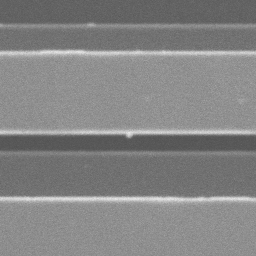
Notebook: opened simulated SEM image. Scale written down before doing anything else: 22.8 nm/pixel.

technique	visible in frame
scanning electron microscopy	lines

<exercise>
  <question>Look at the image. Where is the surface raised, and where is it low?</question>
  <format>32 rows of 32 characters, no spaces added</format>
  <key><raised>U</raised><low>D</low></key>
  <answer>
DDDDDDDDDDDDDDDDDDDDDDDDDDDDDDDD
DDDDDDDDDDDDDDDDDDDDDDDDDDDDDDDD
DDDDDDDDDDDDDDDDDDDDDDDDDDDDDDDD
UUUUUUUUUUUUUUUUUUUUUUUUUUUUUUUU
UUUUUUUUUUUUUUUUUUUUUUUUUUUUUUUU
UUUUUUUUUUUUUUUUUUUUUUUUUUUUUUUU
UUUUUUUUUUUUUUUUUUUUUUUUUUUUUUUU
UUUUUUUUUUUUUUUUUUUUUUUUUUUUUUUU
UUUUUUUUUUUUUUUUUUUUUUUUUUUUUUUU
UUUUUUUUUUUUUUUUUUUUUUUUUUUUUUUU
UUUUUUUUUUUUUUUUUUUUUUUUUUUUUUUU
UUUUUUUUUUUUUUUUUUUUUUUUUUUUUUUU
UUUUUUUUUUUUUUUUUUUUUUUUUUUUUUUU
UUUUUUUUUUUUUUUUUUUUUUUUUUUUUUUU
UUUUUUUUUUUUUUUUUUUUUUUUUUUUUUUU
UUUUUUUUUUUUUUUUUUUUUUUUUUUUUUUU
UUUUUUUUUUUUUUUUUUUUUUUUUUUUUUUU
DDDDDDDDDDDDDDDDDDDDDDDDDDDDDDDD
DDDDDDDDDDDDDDDDDDDDDDDDDDDDDDDD
UUUUUUUUUUUUUUUUUUUUUUUUUUUUUUUU
UUUUUUUUUUUUUUUUUUUUUUUUUUUUUUUU
UUUUUUUUUUUUUUUUUUUUUUUUUUUUUUUU
UUUUUUUUUUUUUUUUUUUUUUUUUUUUUUUU
UUUUUUUUUUUUUUUUUUUUUUUUUUUUUUUU
UUUUUUUUUUUUUUUUUUUUUUUUUUUUUUUU
UUUUUUUUUUUUUUUUUUUUUUUUUUUUUUUU
UUUUUUUUUUUUUUUUUUUUUUUUUUUUUUUU
UUUUUUUUUUUUUUUUUUUUUUUUUUUUUUUU
UUUUUUUUUUUUUUUUUUUUUUUUUUUUUUUU
UUUUUUUUUUUUUUUUUUUUUUUUUUUUUUUU
UUUUUUUUUUUUUUUUUUUUUUUUUUUUUUUU
UUUUUUUUUUUUUUUUUUUUUUUUUUUUUUUU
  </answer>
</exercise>